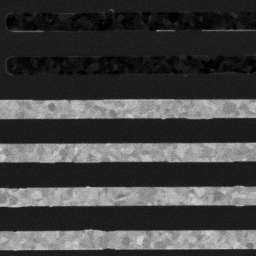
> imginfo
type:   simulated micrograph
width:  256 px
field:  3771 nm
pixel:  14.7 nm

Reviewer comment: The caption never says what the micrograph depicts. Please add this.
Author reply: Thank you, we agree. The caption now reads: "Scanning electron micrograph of parallel lines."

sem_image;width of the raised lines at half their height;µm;0.269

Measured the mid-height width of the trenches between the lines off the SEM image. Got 378 nm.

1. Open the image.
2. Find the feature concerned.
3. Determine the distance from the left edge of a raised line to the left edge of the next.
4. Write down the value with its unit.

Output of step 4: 644 nm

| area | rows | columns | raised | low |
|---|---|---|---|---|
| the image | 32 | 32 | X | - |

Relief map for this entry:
--------------------------------
-------------XX-----------------
-XXXXXXXXXXXXXXXXXXXXXXXXXXXXXXX
-XXXXXXXXXXXXXXXXXXXXXXXXXXXXXXX
--------------------------------
--------------------------------
--------------------------------
-XXXXXXXXXXXXXXXXXXXXXXXXXXXXXXX
-XXXXXXXXXXXXXXXXXXXXXXXXXXXXXXX
--------------------------------
--------------------------------
--------------------------------
--------------------------------
XXXXXXXXXXXXXXXXXXXXXXXXXXXXXXXX
XXXXXXXXXXXXXXXXXXXXXXXXXXXXXXXX
--------------------------------
--------------------------------
--------------------------------
XXXXXXXXXXXXXXXXXXXXXXXXXXXXXXXX
XXXXXXXXXXXXXXXXXXXXXXXXXXXXXXXX
--------------------------------
--------------------------------
--------------------------------
----------XXXXXXXXXXXXXXXXXXXXXX
XXXXXXXXXXXXXXXXXXXXXXXXXXXXXXXX
XXXXXXXXXXXXXXXXXXXXXXXXXXXXXXXX
--------------------------------
--------------------------------
--------------------------------
XXXXXXXXXXXXXXXXXXXXXXXXXXXXXXXX
XXXXXXXXXXXXXXXXXXXXXXXXXXXXXXXX
--------------------------------